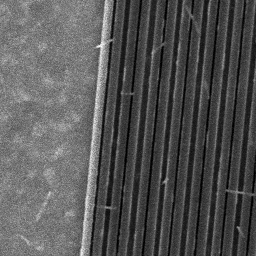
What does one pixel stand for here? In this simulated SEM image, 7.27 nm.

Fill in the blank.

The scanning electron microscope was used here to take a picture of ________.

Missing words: parallel lines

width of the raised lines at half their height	66.9	nm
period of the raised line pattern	0.0937	um